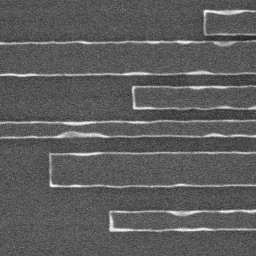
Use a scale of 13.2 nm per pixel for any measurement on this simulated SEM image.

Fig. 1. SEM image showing groups of lines, slits or small figures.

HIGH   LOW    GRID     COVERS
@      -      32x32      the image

--------------------------------
--------------------------@---@@
--------------------------@@@@@@
--------------------------@@@@@@
--------------------------------
@@@@@@@@@@@@@@@@@@@@@@@@@@@@@@@@
@@@@@@@@@@@@@@@@@@@@@@@@@@@@@@@@
@@@@@@@@@@@@@@@@@@@@@@@@@@@@@@@@
@@@@@@@@@@@@@@@@@@@@@@@@@@@@@@@@
--------------------------------
--------------------------------
-----------------@@@@@@@@@@@@@@@
-----------------@@@@@@@@@@@@@@@
-------------------@@@@@@@@--@@@
--------------------------------
@@@@@@@@@@@@@@@@@@@@@@@@@@@@@@@@
@@@@@@@@@@@@@@@@@@@@@@@@@@@@@@@@
--------------------------------
--------------------------------
------@@@@@@@@@@@@@@@@@@@@@@@@@@
------@@@@@@@@@@@@@@@@@@@@@@@@@@
------@@@@@@@@@@@@@@@@@@@@@@@@@@
------@@@@@@@@@@@@@@@@@@@@@@@@@@
--------------------------------
--------------------------------
--------------------------------
--------------@@-@@@@---@@@@@@@@
--------------@@@@@@@@@@@@@@@@@@
--------------@@@@@@@@@@@@@@@@@@
--------------------------------
--------------------------------
--------------------------------